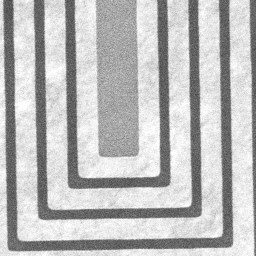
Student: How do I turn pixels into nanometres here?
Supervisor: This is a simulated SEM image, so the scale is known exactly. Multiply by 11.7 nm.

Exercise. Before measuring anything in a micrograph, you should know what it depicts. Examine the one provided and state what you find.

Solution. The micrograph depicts groups of lines, slits or small figures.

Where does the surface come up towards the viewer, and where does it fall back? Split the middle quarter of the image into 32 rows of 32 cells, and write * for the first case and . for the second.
...*****...........****...*****.
...*****...........****...*****.
...*****...........****...*****.
...*****...........****...*****.
...*****...........****...*****.
...*****...........****...*****.
...*****...........*****..*****.
...*****...........*****..*****.
...*****...........*****..*****.
...*****...........*****..*****.
...*****...........*****...****.
*..*****...........*****...****.
*..*****...........*****...****.
*..*****...........*****...****.
*..*****...........*****...****.
*...****...........*****...****.
*...****...........*****...****.
*...****...........*****...****.
*...****...........*****...****.
*...****...........*****...****.
*...****...........*****...****.
*...****...........*****...****.
*...*****..........*****...****.
*...********************...****.
*...********************...****.
*...********************...*****
*...********************...*****
*...********************...*****
*..........................*****
*..........................*****
*.........................******
********************************